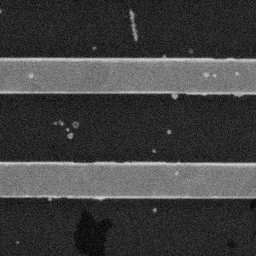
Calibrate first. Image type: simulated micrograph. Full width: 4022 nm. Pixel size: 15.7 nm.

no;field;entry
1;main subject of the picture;lines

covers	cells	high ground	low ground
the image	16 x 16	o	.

................
................
................
................
oooooooooooooooo
oooooooooooooooo
................
................
................
................
oooooooooooooooo
oooooooooooooooo
................
................
................
................